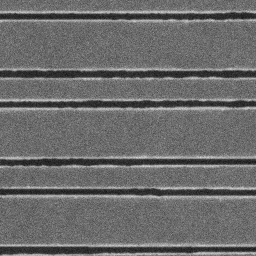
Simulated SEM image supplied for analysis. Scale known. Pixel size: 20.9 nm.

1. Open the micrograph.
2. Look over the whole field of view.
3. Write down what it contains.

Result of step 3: lines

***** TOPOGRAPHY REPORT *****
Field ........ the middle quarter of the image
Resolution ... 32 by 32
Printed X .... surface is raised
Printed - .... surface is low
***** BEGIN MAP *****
XXXXXXXXXXXXXXXXXXXXXXXXXXXXXXXX
--------------------------------
--------------------------------
------------X------------XX---XX
XXXXXXXXXXXXXXXXXXXXXXXXXXXXXXXX
XXXXXXXXXXXXXXXXXXXXXXXXXXXXXXXX
XXXXXXXXXXXXXXXXXXXXXXXXXXXXXXXX
XXXXXXXXXXXXXXXXXXXXXXXXXXXXXXXX
XXXXXXXXXXXXXXXXXXXXXXXXXXXXXXXX
--------------------------------
--------------------------------
XXXXXXXXXXXXXXXXXXXXXXXXXXXXXXXX
XXXXXXXXXXXXXXXXXXXXXXXXXXXXXXXX
XXXXXXXXXXXXXXXXXXXXXXXXXXXXXXXX
XXXXXXXXXXXXXXXXXXXXXXXXXXXXXXXX
XXXXXXXXXXXXXXXXXXXXXXXXXXXXXXXX
XXXXXXXXXXXXXXXXXXXXXXXXXXXXXXXX
XXXXXXXXXXXXXXXXXXXXXXXXXXXXXXXX
XXXXXXXXXXXXXXXXXXXXXXXXXXXXXXXX
XXXXXXXXXXXXXXXXXXXXXXXXXXXXXXXX
XXXXXXXXXXXXXXXXXXXXXXXXXXXXXXXX
XXXXXXXXXXXXXXXXXXXXXXXXXXXXXXXX
XXXXXXXXXXXXXXXXXXXXXXXXXXXXXXXX
--------------------------------
--------------------------------
-XXXX--XXXXXXX---XXX-XXXXXXXXXXX
XXXXXXXXXXXXXXXXXXXXXXXXXXXXXXXX
XXXXXXXXXXXXXXXXXXXXXXXXXXXXXXXX
XXXXXXXXXXXXXXXXXXXXXXXXXXXXXXXX
XXXXXXXXXXXXXXXXXXXXXXXXXXXXXXXX
XXXXXXXXXXXXXXXXXXXXXXXXXXXXXXXX
--------------------------------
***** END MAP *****